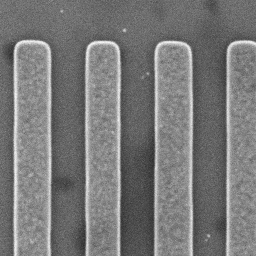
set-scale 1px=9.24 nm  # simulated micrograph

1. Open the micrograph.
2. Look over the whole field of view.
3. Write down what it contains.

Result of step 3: wiring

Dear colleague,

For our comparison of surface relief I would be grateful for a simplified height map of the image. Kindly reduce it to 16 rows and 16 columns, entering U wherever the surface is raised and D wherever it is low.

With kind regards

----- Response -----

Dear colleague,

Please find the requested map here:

DDDDDDDDDDDDDDDD
DDDDDDDDDDDDDDDD
DDDDDDDDDDDDDDDD
DUUDDUUDDDUUDDUU
DUUDDUUDDDUUDDUU
DUUDDUUDDDUUDDUU
DUUDDUUDDDUUDDUU
DUUDDUUDDDUUDDUU
DUUDDUUDDDUUDDUU
DUUDDUUDDDUUDDUU
DUUDDUUDDDUUDDUU
DUUDDUUDDDUUDDUU
DUUDDUUDDDUUDDUU
DUUDDUUDDDUUDDUU
DUUDDUUDDDUUDDUU
DUUDDUUDDDUUDDUU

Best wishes